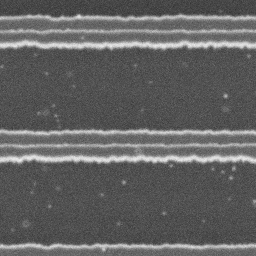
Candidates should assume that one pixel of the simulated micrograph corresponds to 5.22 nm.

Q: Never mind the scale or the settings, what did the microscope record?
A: lines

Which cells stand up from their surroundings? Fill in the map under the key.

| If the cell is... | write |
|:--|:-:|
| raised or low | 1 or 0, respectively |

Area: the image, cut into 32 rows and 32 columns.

00000000000000000000000000000000
00000000000000000000000000000000
11111111111111111111111111111111
11111111111111111111111111111111
11111111111111111111111111111111
11000111111111111111110011011111
00000000000000000000000000000000
00000000000000000000000000000000
00000000000000000000000000000000
00000000000000000000000000000000
00000000000000000000000000000000
00000000000000000000000000000000
00000000000000000000000000000000
00000000000000000000000000000000
00000000000000000000000000000000
00000000000000000000000000000000
11110000111111111111010111111011
11111111111111111111111111111111
11111111111111111111111111111111
11111111111111111111111111111111
00000000000000000000000000000000
00000000000000000000000000000000
00000000000000000000000000000000
00000000000000000000000000000000
00000000000000000000000000000000
00000000000000000000000000000000
00000000000000000000000000000000
00000000000000000000000000000000
00000000000000000000000000000000
00000000000000000000000000000000
00000000000000000000000000000000
11111111111111111111111111111111